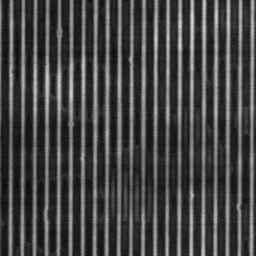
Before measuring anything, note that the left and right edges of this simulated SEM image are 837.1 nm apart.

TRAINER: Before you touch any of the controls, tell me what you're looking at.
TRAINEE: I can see parallel lines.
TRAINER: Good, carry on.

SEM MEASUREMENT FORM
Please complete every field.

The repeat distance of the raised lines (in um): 0.0393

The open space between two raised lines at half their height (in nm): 29.4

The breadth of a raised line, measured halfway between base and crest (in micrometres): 0.009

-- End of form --